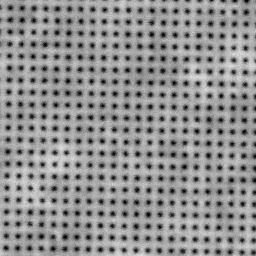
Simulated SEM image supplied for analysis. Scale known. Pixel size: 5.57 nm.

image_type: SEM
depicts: a regular array of holes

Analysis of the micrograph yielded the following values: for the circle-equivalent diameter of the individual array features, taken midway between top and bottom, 23.5 nanometres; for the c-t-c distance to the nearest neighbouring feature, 0.0651 um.